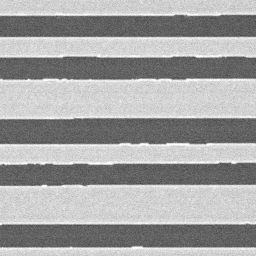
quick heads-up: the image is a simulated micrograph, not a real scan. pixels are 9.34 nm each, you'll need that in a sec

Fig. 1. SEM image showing lines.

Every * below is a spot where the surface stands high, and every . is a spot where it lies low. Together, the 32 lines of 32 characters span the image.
********************************
********************************
................................
................................
................................
********************************
********************************
................................
................................
................................
********************************
********************************
********************************
********************************
********************************
................................
................................
................................
********************************
********************************
................................
................................
................................
********************************
********************************
********************************
********************************
********************************
................................
................................
................................
********************************